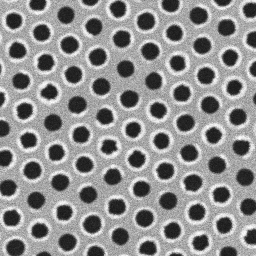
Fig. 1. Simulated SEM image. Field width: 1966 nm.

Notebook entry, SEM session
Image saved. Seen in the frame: a regular array of holes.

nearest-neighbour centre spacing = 0.229 microns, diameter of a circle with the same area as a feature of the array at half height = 132 nm